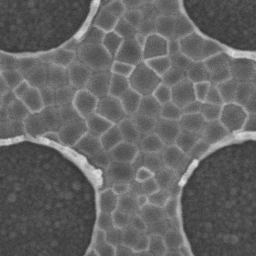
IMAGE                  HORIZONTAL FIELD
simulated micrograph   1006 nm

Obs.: holes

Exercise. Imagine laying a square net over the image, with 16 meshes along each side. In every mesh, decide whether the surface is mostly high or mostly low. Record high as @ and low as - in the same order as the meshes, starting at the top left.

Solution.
------@@@@@@----
-----@@@@@@@----
----@@@@@@@@@---
@@@@@@@@@@@@@@@@
@@@@@@@@@@@@@@@@
@@@@@@@@@@@@@@@@
@@@@@@@@@@@@@@@@
@@@@@@@@@@@@@@@@
@@@@@@@@@@@@@@@@
----@@@@@@@@@---
-----@@@@@@@----
------@@@@@@----
------@@@@@-----
------@@@@@-----
------@@@@@@----
------@@@@@@----